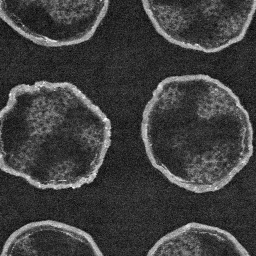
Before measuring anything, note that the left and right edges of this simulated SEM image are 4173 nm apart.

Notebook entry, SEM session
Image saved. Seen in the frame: raised bodies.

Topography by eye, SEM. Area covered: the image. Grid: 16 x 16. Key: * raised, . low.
*******..*******
.*****....*****.
...**......****.
................
................
..**......****..
.*****...******.
*******..*******
*******..*******
******...*******
******....*****.
..***......***..
................
................
.****......***..
******....*****.